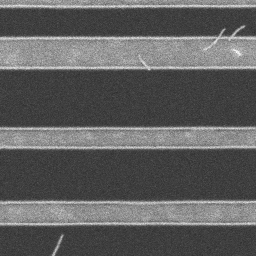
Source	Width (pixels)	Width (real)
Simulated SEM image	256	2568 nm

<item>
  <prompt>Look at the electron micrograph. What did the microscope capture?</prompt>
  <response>one or a few lines or trenches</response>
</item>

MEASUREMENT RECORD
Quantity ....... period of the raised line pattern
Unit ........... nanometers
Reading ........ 765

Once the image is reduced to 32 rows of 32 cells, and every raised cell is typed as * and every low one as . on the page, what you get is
................................
********************************
********************************
********************************
********************************
................................
................................
................................
..........**********************
********************************
********************************
********************************
********************************
********************************
********************************
********************************
................................
................................
**********.*********************
********************************
********************************
********************************
********************************
********************************
********************************
................................
................................
................................
********************************
********************************
********************************
********************************